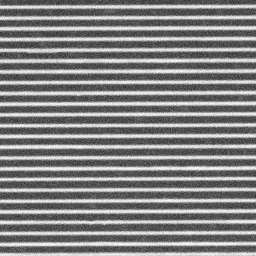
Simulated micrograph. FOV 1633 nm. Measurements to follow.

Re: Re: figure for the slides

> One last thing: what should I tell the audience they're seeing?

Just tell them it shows parallel lines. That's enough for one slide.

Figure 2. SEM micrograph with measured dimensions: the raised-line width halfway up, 15.9 nanometres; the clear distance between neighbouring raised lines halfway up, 54.2 nm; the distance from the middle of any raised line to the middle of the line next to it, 68.8 nm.